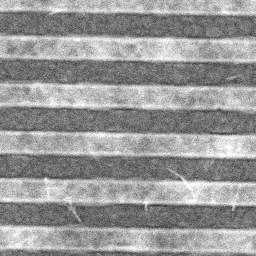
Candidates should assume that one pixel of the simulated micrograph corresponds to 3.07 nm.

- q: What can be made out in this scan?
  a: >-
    parallel lines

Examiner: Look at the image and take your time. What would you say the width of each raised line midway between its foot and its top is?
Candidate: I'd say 21.9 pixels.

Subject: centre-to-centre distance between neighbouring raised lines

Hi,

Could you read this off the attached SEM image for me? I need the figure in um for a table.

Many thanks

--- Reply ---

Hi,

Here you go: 0.146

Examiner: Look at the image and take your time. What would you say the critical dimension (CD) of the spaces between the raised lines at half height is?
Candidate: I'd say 78.2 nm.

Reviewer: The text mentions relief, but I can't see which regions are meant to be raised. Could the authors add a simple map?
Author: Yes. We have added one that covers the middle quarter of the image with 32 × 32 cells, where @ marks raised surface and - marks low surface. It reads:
--------------------------------
--------------------------------
--------------------------------
--------------------------------
--------------------------------
@@@@@@@@@@@@@@@-----------------
@@@@@@@@@@@@@@@@@@@@@@@@@@@@@@@@
@@@@@@@@@@@@@@@@@@@@@@@@@@@@@@@@
@@@@@@@@@@@@@@@@@@@@@@@@@@@@@@@@
@@@@@@@@@@@@@@@@@@@@@@@@@@@@@@@@
@@@@@@@@@@@@@@@@@@@@@@@@@@@@@@@@
--------------------------------
--------------------------------
--------------------------------
--------------------------------
--------------------------------
--------------------------------
@@@@@@@@@@@---------------------
@@@@@@@@@@@@@@@@@@@@@@@@@@@@@@@@
@@@@@@@@@@@@@@@@@@@@@@@@@@@@@@@@
@@@@@@@@@@@@@@@@@@@@@@@@@@@@@@@@
@@@@@@@@@@@@@@@@@@@@@@@@@@@@@@@@
@@@@@@@@@@@@@@@@@@@@@@@@@@@@@@@@
--------------------------------
--------------------------------
--------------------------------
--------------------------------
--------------------------------
--------------------------------
@@@@@@@@@@@@@@@@@@@@@--------@@-
@@@@@@@@@@@@@@@@@@@@@@@@@@@@@@@@
@@@@@@@@@@@@@@@@@@@@@@@@@@@@@@@@